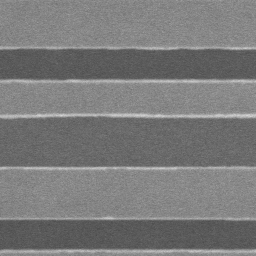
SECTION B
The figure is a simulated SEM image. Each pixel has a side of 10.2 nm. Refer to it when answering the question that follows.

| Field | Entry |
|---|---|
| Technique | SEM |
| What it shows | lines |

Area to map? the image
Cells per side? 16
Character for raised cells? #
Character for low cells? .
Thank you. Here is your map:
################
################
################
................
................
################
################
................
................
................
###...###.######
################
################
################
................
................